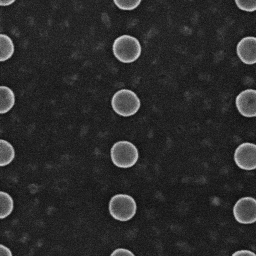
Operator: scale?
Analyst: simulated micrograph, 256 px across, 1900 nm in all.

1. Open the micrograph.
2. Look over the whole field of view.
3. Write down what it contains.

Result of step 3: raised bodies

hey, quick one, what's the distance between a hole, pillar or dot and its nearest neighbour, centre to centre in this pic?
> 388 nm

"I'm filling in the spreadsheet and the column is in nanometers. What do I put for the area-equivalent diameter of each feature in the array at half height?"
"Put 196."